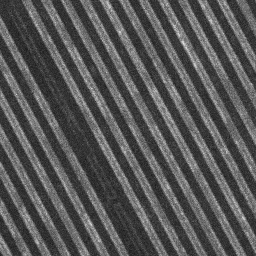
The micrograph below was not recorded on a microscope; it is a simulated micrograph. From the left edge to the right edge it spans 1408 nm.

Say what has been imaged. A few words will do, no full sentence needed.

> parallel lines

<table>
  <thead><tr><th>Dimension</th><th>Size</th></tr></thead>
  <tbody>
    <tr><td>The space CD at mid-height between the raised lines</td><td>52.2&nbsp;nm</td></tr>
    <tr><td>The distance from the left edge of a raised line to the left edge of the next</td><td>94.5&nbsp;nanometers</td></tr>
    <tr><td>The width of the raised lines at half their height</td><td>41.2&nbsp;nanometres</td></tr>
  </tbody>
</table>